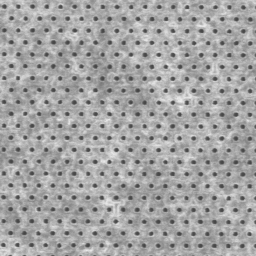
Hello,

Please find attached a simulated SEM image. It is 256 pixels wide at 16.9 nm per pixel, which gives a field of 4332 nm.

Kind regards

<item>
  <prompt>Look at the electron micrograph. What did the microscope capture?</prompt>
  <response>a regular array of holes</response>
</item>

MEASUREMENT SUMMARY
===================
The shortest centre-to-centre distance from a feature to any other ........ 231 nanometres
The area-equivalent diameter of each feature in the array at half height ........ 0.0854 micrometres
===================